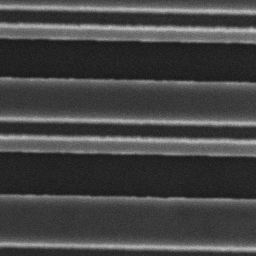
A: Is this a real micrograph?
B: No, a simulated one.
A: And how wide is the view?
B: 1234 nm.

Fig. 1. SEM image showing lines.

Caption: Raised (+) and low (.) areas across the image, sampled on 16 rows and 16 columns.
++++++++++++++++
++++++++++++++++
......++++++++++
................
................
++++++++++++++++
++++++++++++++++
++++++++++++++++
++++++++++++++++
....++++++++++++
................
................
+++++++++++++++.
++++++++++++++++
++++++++++++++++
++++++++++++++++